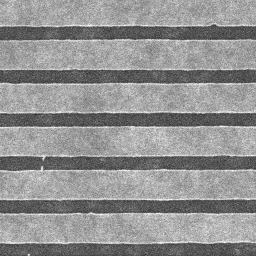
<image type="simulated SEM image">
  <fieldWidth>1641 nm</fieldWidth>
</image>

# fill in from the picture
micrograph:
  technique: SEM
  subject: parallel lines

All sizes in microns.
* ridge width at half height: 0.19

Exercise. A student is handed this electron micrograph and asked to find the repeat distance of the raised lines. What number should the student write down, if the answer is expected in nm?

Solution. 278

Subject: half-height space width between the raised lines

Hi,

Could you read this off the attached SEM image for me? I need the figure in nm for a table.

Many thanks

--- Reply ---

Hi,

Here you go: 90.5